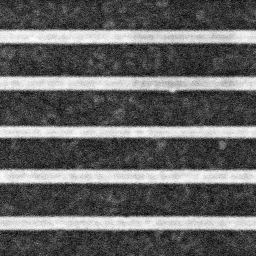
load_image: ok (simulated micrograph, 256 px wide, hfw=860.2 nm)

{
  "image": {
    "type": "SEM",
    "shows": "parallel lines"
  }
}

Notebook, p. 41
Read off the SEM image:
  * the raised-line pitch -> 156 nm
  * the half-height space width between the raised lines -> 115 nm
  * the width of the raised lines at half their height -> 41.1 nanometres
